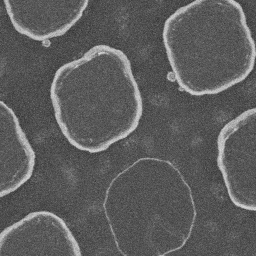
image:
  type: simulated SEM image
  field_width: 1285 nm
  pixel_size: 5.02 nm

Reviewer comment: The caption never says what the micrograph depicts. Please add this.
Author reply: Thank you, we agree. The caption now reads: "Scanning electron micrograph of raised bodies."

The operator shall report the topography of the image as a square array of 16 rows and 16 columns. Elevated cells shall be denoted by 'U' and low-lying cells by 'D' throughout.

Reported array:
DUUUUDDDDDDDUUUD
DUUUDDDDDDUUUUUD
DDDDDDDDDDUUUUUU
DDDDDUUUDDDUUUUU
DDDDUUUUDDDUUUUD
DDDUUUUUUDDDUUDD
DDDDUUUUUDDDDDDD
UDDDUUUUUDDDDDDU
UDDDUUUUDDDDDDUU
UUDDDDDDDDDDDDUU
UUDDDDDDDDDDDDUU
UDDDDDDDDDDDDDUU
DDDDDDDDDDDDDDDU
DDUDDDDDDDDDDDDD
UUUUDDDDDDDDDDDD
UUUUUDDDDDDDDDDD